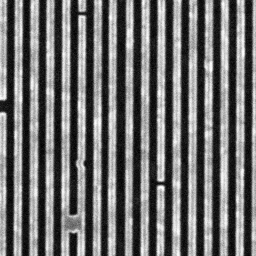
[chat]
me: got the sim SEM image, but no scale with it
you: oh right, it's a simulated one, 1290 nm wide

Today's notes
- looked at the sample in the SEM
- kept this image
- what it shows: parallel lines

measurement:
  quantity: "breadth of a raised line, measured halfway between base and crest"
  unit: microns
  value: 0.034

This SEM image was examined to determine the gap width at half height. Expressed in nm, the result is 47.3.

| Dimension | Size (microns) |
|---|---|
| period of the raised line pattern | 0.08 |